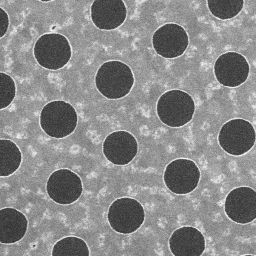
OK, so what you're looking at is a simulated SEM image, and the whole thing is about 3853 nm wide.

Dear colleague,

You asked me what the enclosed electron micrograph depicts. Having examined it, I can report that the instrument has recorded a regular array of holes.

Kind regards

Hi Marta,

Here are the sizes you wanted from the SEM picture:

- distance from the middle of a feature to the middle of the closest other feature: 1.02 microns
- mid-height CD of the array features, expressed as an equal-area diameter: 551 nm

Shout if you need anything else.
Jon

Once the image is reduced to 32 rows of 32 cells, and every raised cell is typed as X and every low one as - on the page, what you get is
XXXXXXXXXXXX----XXXXXXXXXX----XX
-XXXXXXXXXX-----XXXXXXXXXX----XX
-XXXXXXXXXXX----XXXXXXXXXXXXXXXX
-XXXXXXXXXXX---XXXXX---XXXXXXXXX
XXXXX---XXXXXXXXXXX----XXXXXXXXX
XXXX-----XXXXXXXXXX-----XXXXXXXX
XXXX-----XXXXXXXXXXX---XXXXX-XXX
XXXXX----XXXXXXXXXXXXXXXXXX----X
XXXXXX--XXXX----XXXXXXXXXXX----X
-XXXXXXXXXXX-----XXXXXXXXXX----X
--XXXXXXXXXX-----XXXXXXXXXXX--XX
--XXXXXXXXXXX---XXXXX--XXXXXXXXX
--XXXXXXXXXXXXXXXXXX----XXXXXXXX
-XXXX----XXXXXXXXXXX----XXXXXXXX
XXXXX-----XXXXXXXXXX----XXXXXXXX
XXXXX-----XXXXXXXXXXX--XXXXX---X
XXXXXX---XXXXX--XXXXXXXXXXX-----
-XXXXXXXXXXXX----XXXXXXXXXX-----
--XXXXXXXXXXX----XXXXXXXXXXX---X
---XXXXXXXXXX----XXXXXXXXXXXXXXX
---XXXXXXXXXXX--XXXXX---XXXXXXXX
--XXXXX--XXXXXXXXXXXX----XXXXXXX
XXXXXX----XXXXXXXXXX-----XXXXXXX
XXXXXX----XXXXXXXXXXX---XXXXX--X
XXXXXX----XXXXXXXXXXXXXXXXXX----
XXXXXXXX-XXXXX----XXXXXXXXXX----
--XXXXXXXXXXX-----XXXXXXXXXX----
---XXXXXXXXXXX----XXXXXXXXXXX---
---XXXXXXXXXXX---XXXXX--XXXXXXXX
---XXXXXXXXXXXXXXXXXX----XXXXXXX
XXXXXXX----XXXXXXXXXX-----XXXXXX
XXXXXX-----XXXXXXXXXX----XXXXXXX